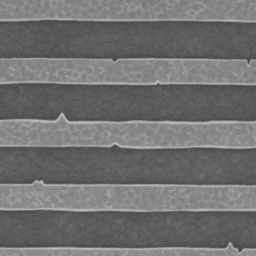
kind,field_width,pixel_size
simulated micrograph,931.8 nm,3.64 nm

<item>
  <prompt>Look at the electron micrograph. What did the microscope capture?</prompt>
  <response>one or a few lines or trenches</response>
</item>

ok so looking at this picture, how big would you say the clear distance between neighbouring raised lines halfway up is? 0.14 um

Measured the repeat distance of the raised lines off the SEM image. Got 230 nm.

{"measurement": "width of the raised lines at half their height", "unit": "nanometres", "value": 92.3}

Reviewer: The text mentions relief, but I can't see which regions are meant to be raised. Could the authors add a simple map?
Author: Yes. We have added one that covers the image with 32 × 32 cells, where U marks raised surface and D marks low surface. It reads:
UUUUUUUUUUUUUUUUUUUUUUUUUUUUUUUU
UUUUUUUUUUUUUUUUUUUUUUUUUUUUUUUU
UUDDDDDDDDDDDUUUUUUUDDDUUUUUUUUU
DDDDDDDDDDDDDDDDDDDDDDDDDDDDDDDD
DDDDDDDDDDDDDDDDDDDDDDDDDDDDDDDD
DDDDDDDDDDDDDDDDDDDDDDDDDDDDDDDD
DDDDDDDDDDDDDDDDDDDDDDDDDDDDDDDD
UUUUUUUUUUUUUUDUUUUUUUUUUUUUUDDD
UUUUUUUUUUUUUUUUUUUUUUUUUUUUUUUU
UUUUUUUUUUUUUUUUUUUUUUUUUUUUUUUU
DDDDDDDDDDDDDDDDDDDDDDDDDDUUUUUU
DDDDDDDDDDDDDDDDDDDDDDDDDDDDDDDD
DDDDDDDDDDDDDDDDDDDDDDDDDDDDDDDD
DDDDDDDDDDDDDDDDDDDDDDDDDDDDDDDD
DDDDDDDDDDDDDDDDDDDDDDDDDDDDDDDD
UUUUUUUUUUUUUUUUUUUUUUUUUUUUUUUU
UUUUUUUUUUUUUUUUUUUUUUUUUUUUUUUU
UUUUUUUUUUUUUUUUUUUUUUUUUUUUUUUU
DDDDDDDDDDDDDDDDDDDDDDDDDDDDDDDD
DDDDDDDDDDDDDDDDDDDDDDDDDDDDDDDD
DDDDDDDDDDDDDDDDDDDDDDDDDDDDDDDD
DDDDDDDDDDDDDDDDDDDDDDDDDDDDDDDD
DDDDDDDDDDDDDDDDDDDDDDDDDDDDDDDD
UUUUUUUUUUUUUUUUUUUUUUUUUUUUUUUU
UUUUUUUUUUUUUUUUUUUUUUUUUUUUUUUU
UUUUUUUUUUUUUUUUUUUUUUUUUUUUUUUU
DDDDDDDDDDDDDDDDDDDDDDDDDDDDDDDD
DDDDDDDDDDDDDDDDDDDDDDDDDDDDDDDD
DDDDDDDDDDDDDDDDDDDDDDDDDDDDDDDD
DDDDDDDDDDDDDDDDDDDDDDDDDDDDDDDD
DDDDDDDDDDDDDDDDDDDDDDDDDDDDDDDD
UUUUUUUUUUUUUUUUUUUUUUUUUUUUUUUU